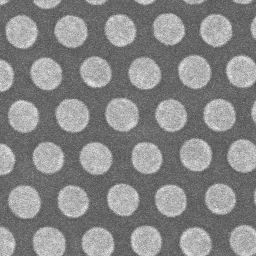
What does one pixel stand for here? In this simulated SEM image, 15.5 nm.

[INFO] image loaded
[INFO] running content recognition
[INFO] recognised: a regular array of raised bodies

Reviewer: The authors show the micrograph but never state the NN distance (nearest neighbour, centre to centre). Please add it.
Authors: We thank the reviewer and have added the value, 742 nm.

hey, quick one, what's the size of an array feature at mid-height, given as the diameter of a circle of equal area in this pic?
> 476 nanometres